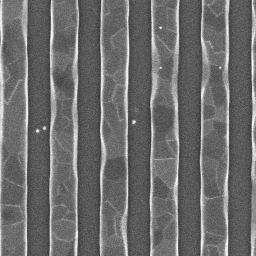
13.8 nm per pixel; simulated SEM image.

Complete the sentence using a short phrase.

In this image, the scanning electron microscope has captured wiring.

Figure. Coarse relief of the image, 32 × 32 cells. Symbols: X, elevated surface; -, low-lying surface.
XXX---XXXX---XXX---XXX---XXX----
XXX---XXXX---XXX---XXX---XXX----
XXX----XXX---XXX---XXX---XXX----
XXX----XXX---XXX---XXX---XXX----
XXX---XXXX---XXX---XXX---XXX----
XXX---XXXX---XXX---XXX---XXX----
XXX---XXXX---XXX---XXX----XX----
XXX---XXX----XXX---XXX----XX----
XXX---XXX----XXX---XXX----XX----
XXX---XXX----XXX---XXX----XX----
XXX----XX----XXX---XXX----XX----
XXX----XX----XXX---XXX---XXXX---
XXX----XX----XXX---XXX---XXXX---
XXX----XX----XXX---XXX---XXXX---
XXX----XX----XXX---XXX---XXXX---
XXX---XXX----XXX---XXX---XXXX---
XXX---XXX----XXX---XXX---XXX----
XXX---XXX----XXX---XXX---XXXX---
XXX---XXX----XXX---XXX---XXXX---
XXX---XXX----XXX---XXX---XXXX---
XXX---XXX----XXX---XXX---XXXX---
XXX---XXX----XXX---XXX---XXXX---
XXX---XXXX---XXX---XXX---XXX----
XXX---XXX----XXX---XXX---XXX----
XXX---XXXX---XXX---XXX---XXX----
XXX---XXXX---XXX---XXX---XXX----
XXX---XXXX---XXX---XXX---XXX----
XXX---XXXX---XXX---XXX---XXX----
XXX---XXXX---XX----XXX---XXX----
XXX---XXXX---XXX---XXX---XXX----
XXX---XXX----XXX---XXX---XXX----
XXX---XXX----XXX---XXX---XXX----